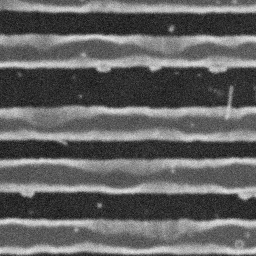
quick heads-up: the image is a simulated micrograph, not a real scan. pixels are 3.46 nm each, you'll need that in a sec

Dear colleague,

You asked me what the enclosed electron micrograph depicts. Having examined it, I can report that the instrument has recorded lines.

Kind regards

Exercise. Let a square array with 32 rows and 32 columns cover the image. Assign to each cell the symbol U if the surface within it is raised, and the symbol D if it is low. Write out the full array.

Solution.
DUUUUUUUUUUUUUUUUUUUUUUUUUUUUUUU
DDDDDDDDDDDDDDDDDDDDDDDDDDDDDDDD
DDDDDDDDDDDDDDDDDDDDDDDDDDDDDDDD
DDDDDDDDDDDDDDDDDDDDDDDDDDDDDDDD
DDDDDDDDDDDDDDDDDDDDDDDDDDDDDDDD
UUUUUUUUUUUUUUUUUUUUUUUUUUUUUUUU
UUUUUUUUUUUUUUUUUUUUUUUUUUUUUUUU
UUUUUUUUUUUUUUUUUUUUUUUUUUUUUUUU
DDDDDDDDDDDDDDDDDDDDDDDDDDDDDDDD
DDDDDDDDDDDDDDDDDDDDDDDDDDDDDDDD
DDDDDDDDDDDDDDDDDDDDDDDDDDDDDDDD
DDDDDDDDDDDDDDDDDDDDDDDDDDDDDDDD
DDDDDDDDDDDDDDDDDDDDDDDDDDDDDDDD
DDDDDDDDDDDDDDDDDDDDDDDDDDDDDDDD
UUUUUUUUUUUUUUUUUUUUUUUUUUUUUUUU
UUUUUUUUUUUUUUUUUUUUUUUUUUUUUUUU
UUUUUUUUUUUUUUUUUUUUUUUUUUUUUUUU
DDDDDDDDDDDDDDDDDDDDDDDDDDDDDDDD
DDDDDDDDDDDDDDDDDDDDDDDDDDDDDDDD
DDDDDDDDDDDDDDDDDDDDDDDDDDDDDDDD
UUUUUUUUUUUDDDDDDDDDUUUUUUUUUUUU
UUUUUUUUUUUUUUUUUUUUUUUUUUUUUUUU
UUUUUUUUUUUUUUUUUUUUUUUUUUUUUUUU
UUUUUUUUUUUUUUUUUUUUUUUUUUUUUUUU
DDDDDDDDDDDDDDDDDDDDDDDDDDDDDDDD
DDDDDDDDDDDDDDDDDDDDDDDDDDDDDDDD
DDDDDDDDDDDDDDDDDDDDDDDDDDDDDDDD
DDDDDDDDDDDDDDDDDDDDDDDDDDDDDDDD
UUUUUUUUUUUUUUUUUUUUDDUUUUUUUUUU
UUUUUUUUUUUUUUUUUUUUUUUUUUUUUUUU
UUUUUUUUUUUUUUUUUUUUUUUUUUUUUUUU
DDUUDDDDDDDDDDDDUUUDDDDDDDDDDUUU